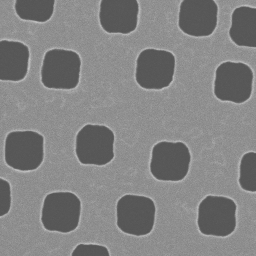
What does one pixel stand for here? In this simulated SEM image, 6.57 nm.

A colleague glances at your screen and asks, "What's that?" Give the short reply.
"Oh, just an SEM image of a regular array of holes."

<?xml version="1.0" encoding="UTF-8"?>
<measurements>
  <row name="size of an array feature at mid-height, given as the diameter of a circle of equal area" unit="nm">271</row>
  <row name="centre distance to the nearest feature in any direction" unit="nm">474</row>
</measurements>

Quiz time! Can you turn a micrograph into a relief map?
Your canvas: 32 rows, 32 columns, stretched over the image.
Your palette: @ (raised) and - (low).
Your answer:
@@-----@@@@@@----@@@@@@----@@@@@
@@-----@@@@@-----@@@@@-----@@---
@@@@--@@@@@@@----@@@@@-----@@---
@@@@@@@@@@@@@----@@@@@@----@@---
@@@@@@@@@@@@@@@@@@@@@@@@--@@@---
---@@@@@@@@@@@@@@@@@@@@@@@@@@@--
----@@---@@@@@@@@@---@@@@@@@@@@@
----@-----@@@@@@@-----@@@@@@@@@@
---@@-----@@@@@@@-----@@@@@----@
---@@-----@@@@@@@-----@@@@@-----
@@@@@-----@@@@@@@----@@@@@@----@
@@@@@@@@@@@@@@@@@@@@@@@@@@@----@
@@@@@@@@@@@@@@@@@@@@@@@@@@@@---@
@@@@@@@@@@@@@@@@@@@@@@@@@@@@@@@@
@@@@@@@@@@@@@@@@@@@@@@@@@@@@@@@@
@@@@@@@@@@@@@@@@@@@@@@@@@@@@@@@@
@@--@@@@@@----@@@@@@@@@@@@@@@@@@
@----@@@@@----@@@@@@@@@@@@@@@@@@
@----@@@@@----@@@@@----@@@@@@@@@
@----@@@@@----@@@@@-----@@@@@@@-
@----@@@@@@--@@@@@@-----@@@@@@--
@@@@@@@@@@@@@@@@@@@----@@@@@@@--
@@@@@@@@@@@@@@@@@@@@--@@@@@@@@--
-@@@@@@@@@@@@@@@@@@@@@@@@@@@@@--
-@@@@@----@@@@@---@@@@@@@@-@@@@@
-@@@@-----@@@@@----@@@@@@----@@@
-@@@@-----@@@@@----@@@@@@----@@@
@@@@@-----@@@@@----@@@@@@----@@@
@@@@@@---@@@@@@----@@@@@@----@@@
@@@@@@@@@@@@@@@@@@@@@@@@@@@-@@@@
@@@@@@@@@@@@@@@@@@@@@@@@@@@@@@@@
@@@@@@@@@-----@@@@@@@@@@@@@@@@@@